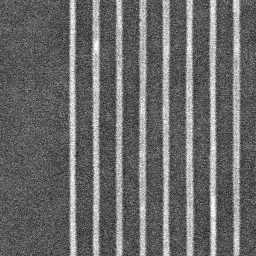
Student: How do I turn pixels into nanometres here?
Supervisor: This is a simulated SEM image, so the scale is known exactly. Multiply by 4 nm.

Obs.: parallel lines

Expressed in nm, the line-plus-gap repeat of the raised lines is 93.6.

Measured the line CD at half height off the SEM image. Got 0.0175 um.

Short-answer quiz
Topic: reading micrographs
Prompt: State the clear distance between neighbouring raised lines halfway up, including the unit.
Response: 18.4 px